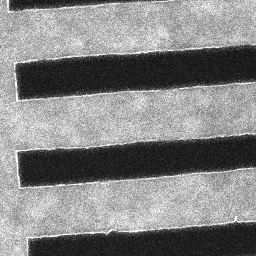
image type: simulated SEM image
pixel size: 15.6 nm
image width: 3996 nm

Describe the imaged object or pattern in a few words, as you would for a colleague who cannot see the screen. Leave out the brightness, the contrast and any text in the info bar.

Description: one or a few lines or trenches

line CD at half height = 601 nm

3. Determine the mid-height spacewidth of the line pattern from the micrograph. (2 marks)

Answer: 778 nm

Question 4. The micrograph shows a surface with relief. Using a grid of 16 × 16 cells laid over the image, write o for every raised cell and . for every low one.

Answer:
.ooo............
................
................
.....ooooooooooo
.ooooooooooooooo
.ooooooooooo....
................
................
..............oo
.ooooooooooooooo
.ooooooooooooooo
.oooo...........
................
.......o........
......oooooooooo
..oooooooooooooo